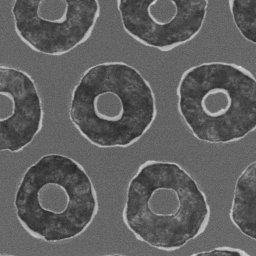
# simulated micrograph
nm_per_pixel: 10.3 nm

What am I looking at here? ring-shaped grooves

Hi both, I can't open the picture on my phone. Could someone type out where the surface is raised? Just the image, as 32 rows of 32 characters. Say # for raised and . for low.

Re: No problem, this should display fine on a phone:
##...###....###....###....###...
##...###....###....###....###...
##....##....###....##....####...
##.........#####.........#####..
###........######.......#######.
####......########....##########
#####...########################
################################
.###########....########......##
...#######........#####........#
....######.........####.........
.....####..........####...##....
#....####...###....####..####...
##...####...###....###...###....
#....####....##....####.........
.....####..........#####........
.....#####........######.......#
....#######......#########...###
...#############################
######..########################
####......#########..###########
###........#######.....########.
###........######.......######..
##...###....####.........#####..
##...####...####...###...####...
##...###....####...###....###...
##....##....####...###....###...
###........#####..........###...
###........#####.........#####..
#####....########.......#######.
###################....#########
##########################....##